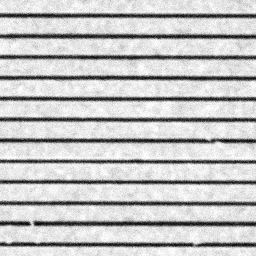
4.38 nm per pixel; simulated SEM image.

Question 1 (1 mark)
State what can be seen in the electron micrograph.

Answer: parallel lines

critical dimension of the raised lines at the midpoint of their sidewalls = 68.4 nanometers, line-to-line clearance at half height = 0.0257 micrometres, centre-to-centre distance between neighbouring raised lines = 0.0912 µm